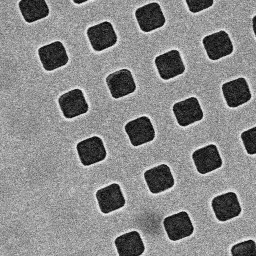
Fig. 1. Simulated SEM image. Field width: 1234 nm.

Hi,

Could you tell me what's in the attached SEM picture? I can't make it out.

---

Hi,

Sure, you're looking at a regular array of holes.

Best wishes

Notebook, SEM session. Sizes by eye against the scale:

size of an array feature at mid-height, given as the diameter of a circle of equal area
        28.7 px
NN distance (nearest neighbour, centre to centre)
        245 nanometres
